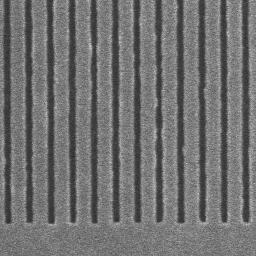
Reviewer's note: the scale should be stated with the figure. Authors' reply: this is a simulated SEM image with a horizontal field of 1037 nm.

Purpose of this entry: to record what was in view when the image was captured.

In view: parallel lines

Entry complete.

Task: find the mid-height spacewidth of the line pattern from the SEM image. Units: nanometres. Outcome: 24.3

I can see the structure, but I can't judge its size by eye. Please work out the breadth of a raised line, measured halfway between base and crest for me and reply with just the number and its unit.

62.7 nanometres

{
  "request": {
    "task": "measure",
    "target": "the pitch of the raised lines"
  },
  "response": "87.6 nanometers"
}